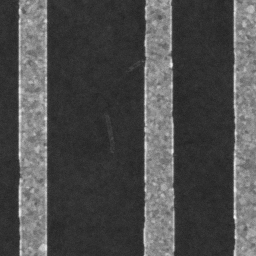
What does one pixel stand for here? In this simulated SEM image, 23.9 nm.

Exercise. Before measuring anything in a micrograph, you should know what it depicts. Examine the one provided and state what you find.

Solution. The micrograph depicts lines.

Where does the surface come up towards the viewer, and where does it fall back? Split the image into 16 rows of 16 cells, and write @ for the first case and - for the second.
-@@------@@----@
-@@------@@----@
-@@------@@----@
-@@------@@----@
-@@------@@----@
-@@------@@----@
-@@------@@----@
-@@------@@----@
-@@------@@----@
-@@------@@----@
-@@------@@----@
-@@------@@----@
-@@------@@----@
-@@------@@----@
-@@------@@----@
-@@------@@----@